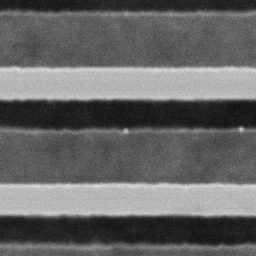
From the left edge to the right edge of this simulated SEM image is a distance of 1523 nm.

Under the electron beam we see lines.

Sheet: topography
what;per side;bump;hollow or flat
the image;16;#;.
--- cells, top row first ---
................
################
################
################
################
################
................
................
################
################
################
################
################
................
................
################